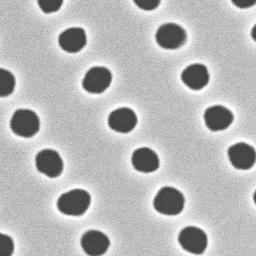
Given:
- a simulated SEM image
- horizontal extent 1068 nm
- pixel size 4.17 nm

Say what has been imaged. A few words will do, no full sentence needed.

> a regular array of holes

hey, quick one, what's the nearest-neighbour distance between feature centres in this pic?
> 0.194 µm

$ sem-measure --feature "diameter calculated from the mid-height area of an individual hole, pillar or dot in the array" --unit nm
121